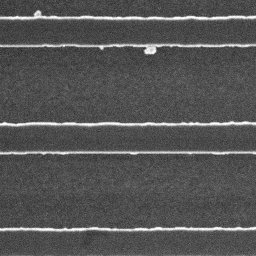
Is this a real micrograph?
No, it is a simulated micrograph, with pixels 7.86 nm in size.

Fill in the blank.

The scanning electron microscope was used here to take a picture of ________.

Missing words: lines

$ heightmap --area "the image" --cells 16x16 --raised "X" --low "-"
----------------
XXXXXXXXXXXXXXXX
XXXXXXXXXXXXXXXX
----------------
----------------
----------------
----------------
----------------
XXXXXXXXXXXXXXXX
XXXXXXXXXXXXXXXX
----------------
----------------
----------------
----------------
XXXXXXXXXXXXXXXX
XXXXXXXXXXXXXXXX